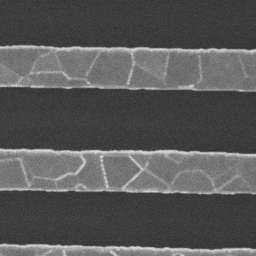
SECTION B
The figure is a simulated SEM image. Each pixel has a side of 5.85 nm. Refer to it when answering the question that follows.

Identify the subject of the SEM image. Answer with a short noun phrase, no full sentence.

lines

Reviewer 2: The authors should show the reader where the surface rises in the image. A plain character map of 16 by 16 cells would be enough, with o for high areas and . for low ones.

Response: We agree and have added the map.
................
................
................
oooooooooooooooo
oooooooooooooooo
........oooooooo
................
................
................
ooooooooooooo...
oooooooooooooooo
oooooooooooooooo
................
................
................
ooooooooooo.....